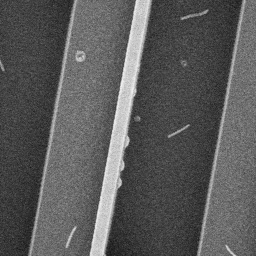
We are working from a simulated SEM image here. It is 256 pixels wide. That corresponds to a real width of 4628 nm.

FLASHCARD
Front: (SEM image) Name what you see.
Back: lines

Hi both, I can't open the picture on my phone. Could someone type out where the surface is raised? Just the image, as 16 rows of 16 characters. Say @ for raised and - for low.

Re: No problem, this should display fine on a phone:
-----@@@@------@
----@@@@@------@
----@@@@@------@
----@@@@@------@
----@@@@@-----@@
----@@@@------@@
----@@@@------@@
---@@@@@------@@
---@@@@@------@@
---@@@@@------@@
---@@@@@-----@@@
---@@@@------@@@
--@@@@@------@@@
--@@@@@------@@@
--@@@@@------@@@
--@@@@@------@@@